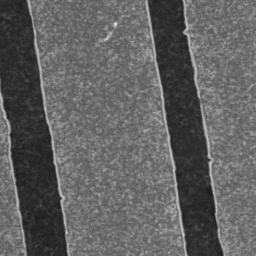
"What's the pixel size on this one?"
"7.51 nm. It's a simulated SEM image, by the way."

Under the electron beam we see one or a few lines or trenches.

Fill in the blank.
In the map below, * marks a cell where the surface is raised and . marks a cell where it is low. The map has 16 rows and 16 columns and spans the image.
..*******...****
..*******...****
..********..****
..********..****
...*******..****
...*******..****
...*******...***
...*******...***
*..********..***
*..********..***
*...*******..***
*...*******..***
*...*******..***
*...*******...**
*...*******...**
**..********..**